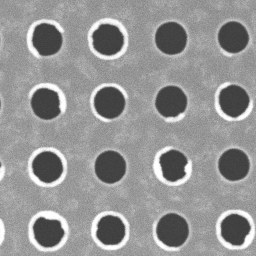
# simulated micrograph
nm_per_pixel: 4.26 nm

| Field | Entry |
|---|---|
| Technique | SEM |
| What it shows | a regular array of holes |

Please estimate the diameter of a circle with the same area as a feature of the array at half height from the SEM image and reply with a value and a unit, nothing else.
134 nanometres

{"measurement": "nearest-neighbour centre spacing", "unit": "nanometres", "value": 264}